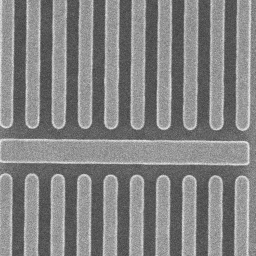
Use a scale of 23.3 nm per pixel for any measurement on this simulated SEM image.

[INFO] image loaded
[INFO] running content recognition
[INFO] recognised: groups of lines, slits or small figures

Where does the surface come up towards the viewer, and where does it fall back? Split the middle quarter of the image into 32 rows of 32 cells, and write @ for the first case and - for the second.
----@@@---@@@@---@@@----@@@---@@
----@@@---@@@@---@@@----@@@---@@
----@@@---@@@@---@@@----@@@---@@
----@@@---@@@@---@@@----@@@---@@
----@@@---@@@@---@@@----@@@---@@
----@@@---@@@----@@@---@@@@---@@
----@@@---@@@----@@@---@@@@---@@
----@@@---@@@----@@@---@@@@---@@
----@@@---@@@----@@@---@@@@---@@
----@@@---@@@----@@@---@@@@---@@
----@@@---@@@----@@@---@@@@---@@
----@@@---@@@----@@@---@@@@---@@
----@@@---@@@----@@@---@@@----@@
----@@@---@@@----@@@---@@@----@@
----@@@---@@@----@@@---@@@----@@
----@@----@@@----@@@----@@----@@
--------------------------------
--------------------------------
--------------------------------
@@@@@@@@@@@@@@@@@@@@@@@@@@@@@@@@
@@@@@@@@@@@@@@@@@@@@@@@@@@@@@@@@
@@@@@@@@@@@@@@@@@@@@@@@@@@@@@@@@
@@@@@@@@@@@@@@@@@@@@@@@@@@@@@@@@
@@@@@@@@@@@@@@@@@@@@@@@@@@@@@@@@
@@@@@@@@@@@@@@@@@@@@@@@@@@@@@@@@
--------------------------------
--------------------------------
--------------------------------
----@@@---@@@----@@@----@@----@@
---@@@@---@@@----@@@---@@@----@@
---@@@@---@@@----@@@---@@@----@@
---@@@@---@@@----@@@---@@@----@@